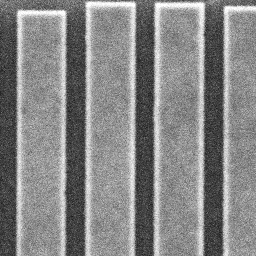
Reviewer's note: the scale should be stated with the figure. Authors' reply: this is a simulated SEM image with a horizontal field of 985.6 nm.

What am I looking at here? one or a few lines or trenches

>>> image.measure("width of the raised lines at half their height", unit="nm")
173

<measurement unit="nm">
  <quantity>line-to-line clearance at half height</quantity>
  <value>90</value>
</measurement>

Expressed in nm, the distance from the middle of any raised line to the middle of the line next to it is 265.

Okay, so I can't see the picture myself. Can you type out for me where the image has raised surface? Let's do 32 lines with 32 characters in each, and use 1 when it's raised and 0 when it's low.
00000000000100010000000000000000
00000000000111111000111110001111
00111111000111111000111110001111
00111111000111111000111110001111
00111111000111111000111110001111
00111111000111111000111110001111
00111111000111111000111110001111
00111111000111111000111110001111
00111111000111111000111110001111
00111111000111111000111110001111
00111111000111111000111110001111
00111111000111111000111110001111
00111111000111111000111110001111
00111111000111111000111110001111
00111111000111111000111110001111
00111111000111111000111110001111
00111111000111111000111110001111
00111111000111111000111110001111
00111111000111111000111110001111
00111111000111111000111110001111
00111111000111111000111110001111
00111111000111111000111110001111
00111111000111111000111110001111
00111111000111111000111110001111
00111111000111111000111110001111
00111111000111111000111110001111
00111111000111111000111110001111
00111111000111111000111110001111
00111111000111111000111110001111
00111111000111111000111110001111
00111111000111111000111110001111
00111111000111111000111110001111